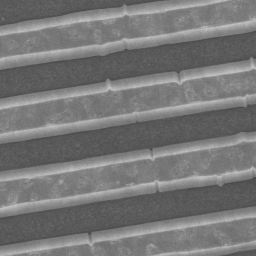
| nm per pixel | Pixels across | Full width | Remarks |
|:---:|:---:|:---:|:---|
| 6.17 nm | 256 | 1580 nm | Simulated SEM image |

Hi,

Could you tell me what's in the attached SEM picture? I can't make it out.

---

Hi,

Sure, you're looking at one or a few lines or trenches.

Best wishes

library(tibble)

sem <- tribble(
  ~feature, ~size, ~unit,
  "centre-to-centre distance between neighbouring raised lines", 447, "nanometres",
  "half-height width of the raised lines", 220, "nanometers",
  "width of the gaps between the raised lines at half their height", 224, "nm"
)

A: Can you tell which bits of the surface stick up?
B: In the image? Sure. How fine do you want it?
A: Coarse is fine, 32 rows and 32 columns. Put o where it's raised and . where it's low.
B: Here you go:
......................oooooooooo
..............oooooooooooooooooo
.......ooooooooooooooooooooooooo
..ooooooooooooooooooooooooooooo.
oooooooooooooooooooooooo........
ooooooooooooooooo...............
ooooooooooo.....................
oooo............................
............................oooo
.......................ooooooooo
...............ooooooooooooooooo
........oooooooooooooooooooooooo
..ooooooooooooooooooooooooooooo.
ooooooooooooooooooooooooo.......
ooooooooooooooooooo.............
ooooooooooooo...................
ooooooo.........................
.............................ooo
.......................ooooooooo
................oooooooooooooooo
..........oooooooooooooooooooooo
...ooooooooooooooooooooooooooooo
oooooooooooooooooooooooooooo....
ooooooooooooooooooo.............
ooooooooooooo...................
oooooooo........................
o..............................o
........................oooooooo
..................oooooooooooooo
............oooooooooooooooooooo
.....ooooooooooooooooooooooooooo
ooooooooooooooooooooooooooo.....